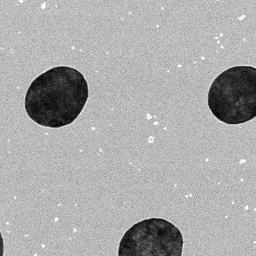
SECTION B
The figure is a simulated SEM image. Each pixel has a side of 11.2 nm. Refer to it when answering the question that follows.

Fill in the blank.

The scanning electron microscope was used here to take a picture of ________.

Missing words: holes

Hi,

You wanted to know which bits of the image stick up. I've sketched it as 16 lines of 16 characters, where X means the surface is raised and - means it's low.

XXXXXXXXXXXXXXXX
XXXXXXXXXXXXXXXX
XXXXXXXXXXXXXXXX
XXXXXXXXXXXXXXXX
XXX--XXXXXXXXX--
XX---XXXXXXXX---
XX---XXXXXXXX---
XX---XXXXXXXXX--
XXXXXXXXXXXXXXXX
XXXXXXXXXXXXXXXX
XXXXXXXXXXXXXXXX
XXXXXXXXXXXXXXXX
XXXXXXXXXXXXXXXX
XXXXXXXXXXXXXXXX
XXXXXXXX---XXXXX
XXXXXXX----XXXXX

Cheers